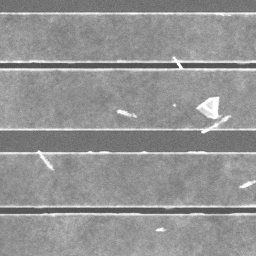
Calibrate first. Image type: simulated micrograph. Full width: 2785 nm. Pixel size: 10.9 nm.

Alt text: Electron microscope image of lines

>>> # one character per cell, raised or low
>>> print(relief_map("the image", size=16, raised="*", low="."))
................
****************
****************
****************
****************
****************
****************
****************
................
................
****************
****************
****************
****************
****************
****************